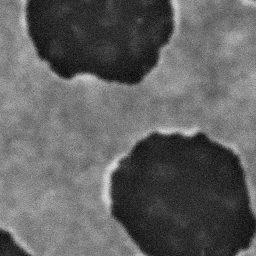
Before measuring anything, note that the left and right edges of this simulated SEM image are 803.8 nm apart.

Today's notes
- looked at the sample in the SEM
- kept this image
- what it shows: holes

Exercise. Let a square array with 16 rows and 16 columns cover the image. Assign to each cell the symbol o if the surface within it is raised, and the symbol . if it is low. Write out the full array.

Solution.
oo.........ooooo
oo.........ooooo
oo.........ooooo
oo........oooooo
ooo......ooooooo
oooooooooooooooo
oooooooooooooooo
oooooooooooooooo
ooooooooo....ooo
oooooooo.......o
ooooooo........o
ooooooo........o
ooooooo.........
ooooooo.........
.ooooooo........
.oooooooo......o